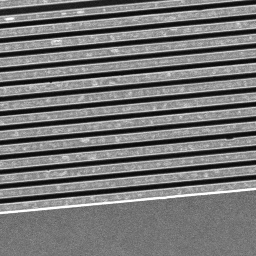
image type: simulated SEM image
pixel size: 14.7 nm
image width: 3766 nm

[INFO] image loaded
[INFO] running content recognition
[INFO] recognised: parallel lines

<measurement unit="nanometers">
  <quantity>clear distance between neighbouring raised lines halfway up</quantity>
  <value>76.9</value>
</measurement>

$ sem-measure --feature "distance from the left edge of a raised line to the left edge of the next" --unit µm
0.213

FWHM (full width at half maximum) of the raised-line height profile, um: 0.141